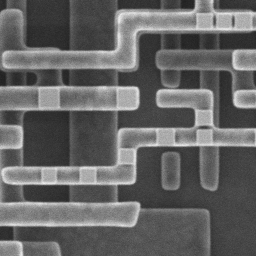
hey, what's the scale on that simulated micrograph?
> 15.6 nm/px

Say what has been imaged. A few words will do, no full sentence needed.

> wiring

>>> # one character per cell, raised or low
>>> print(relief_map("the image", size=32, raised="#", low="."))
........................###.....
###............#################
###...........##################
###...........##################
###...........####..............
###...........###...............
#################...############
#################..#############
#################...############
....####.....................###
....####.....................###
#################...######...###
#################...#######..###
#################.......###...##
###.....................###.....
###.....................###.....
###............#################
###............#################
###............##...............
###............##...............
###...........###...............
#################...............
#################...............
###.............................
###.............................
#################...............
#################...............
#################...............
................................
................................
#######.........................
########........................